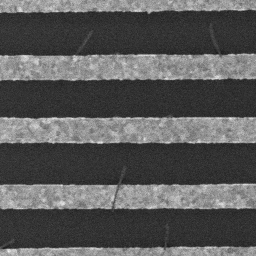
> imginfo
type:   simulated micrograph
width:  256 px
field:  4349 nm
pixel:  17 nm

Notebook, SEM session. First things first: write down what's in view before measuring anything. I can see lines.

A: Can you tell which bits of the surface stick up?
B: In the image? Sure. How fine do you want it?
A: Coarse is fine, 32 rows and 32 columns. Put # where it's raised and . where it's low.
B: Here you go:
################################
##.#.##...........#.............
................................
................................
................................
................................
................................
################################
################################
################################
................................
................................
................................
................................
................................
################################
################################
################################
................................
................................
................................
................................
................................
################################
################################
################################
................................
................................
................................
................................
................................
################################